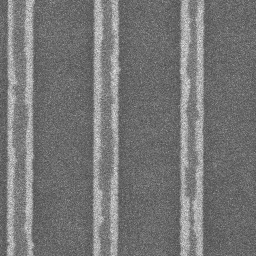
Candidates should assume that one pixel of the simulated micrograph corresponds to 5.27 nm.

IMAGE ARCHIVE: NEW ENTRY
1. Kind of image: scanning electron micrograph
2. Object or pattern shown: one or a few lines or trenches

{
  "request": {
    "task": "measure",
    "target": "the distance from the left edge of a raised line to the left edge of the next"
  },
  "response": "453 nm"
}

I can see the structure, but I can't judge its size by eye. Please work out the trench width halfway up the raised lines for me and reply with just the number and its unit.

345 nm